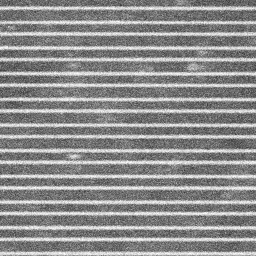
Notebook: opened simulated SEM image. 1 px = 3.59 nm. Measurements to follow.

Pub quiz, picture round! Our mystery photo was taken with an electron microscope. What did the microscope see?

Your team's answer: parallel lines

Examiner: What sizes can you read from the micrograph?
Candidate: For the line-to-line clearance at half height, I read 40.8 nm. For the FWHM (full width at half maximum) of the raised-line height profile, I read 9.9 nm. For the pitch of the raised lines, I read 46.4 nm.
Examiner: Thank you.